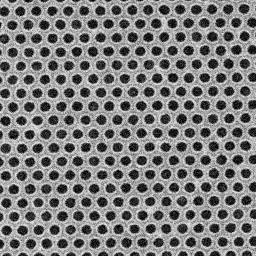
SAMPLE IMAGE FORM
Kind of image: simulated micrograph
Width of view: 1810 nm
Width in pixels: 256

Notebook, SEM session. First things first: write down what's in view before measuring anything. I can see a regular array of holes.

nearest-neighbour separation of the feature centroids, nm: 110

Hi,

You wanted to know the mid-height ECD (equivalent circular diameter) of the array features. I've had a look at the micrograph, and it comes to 0.0818 µm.